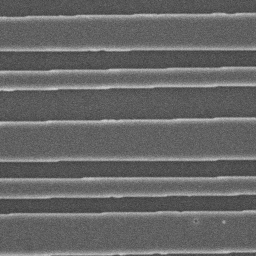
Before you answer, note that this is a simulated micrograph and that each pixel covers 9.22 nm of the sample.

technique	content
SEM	lines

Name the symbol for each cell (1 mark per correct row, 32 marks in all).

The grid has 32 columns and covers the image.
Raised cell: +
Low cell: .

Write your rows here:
................................
................................
++++++++++++++++++++++++++++++++
++++++++++++++++++++++++++++++++
++++++++++++++++++++++++++++++++
++++++++++++++++++++++++++++++++
................................
................................
...........................+++++
++++++++++++++++++++++++++++++++
++++++++++++++++++++++++++++++++
................................
................................
................................
................................
++++++++++++++++++++++++++++++++
++++++++++++++++++++++++++++++++
++++++++++++++++++++++++++++++++
++++++++++++++++++++++++++++++++
++++++++++++++++++++++++++++++++
................................
................................
++++++++++++++++++++++++++++++++
++++++++++++++++++++++++++++++++
++++++++++++++++................
................................
...................+++++++++++++
++++++++++++++++++++++++++++++++
++++++++++++++++++++++++++++++++
++++++++++++++++++++++++++++++++
++++++++++++++++++++++++++++++++
+++++++++++++++++++++++++++++...